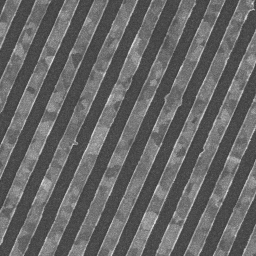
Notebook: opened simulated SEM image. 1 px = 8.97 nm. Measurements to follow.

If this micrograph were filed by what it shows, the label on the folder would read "parallel lines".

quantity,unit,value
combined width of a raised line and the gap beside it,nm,239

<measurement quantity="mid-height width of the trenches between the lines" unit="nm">124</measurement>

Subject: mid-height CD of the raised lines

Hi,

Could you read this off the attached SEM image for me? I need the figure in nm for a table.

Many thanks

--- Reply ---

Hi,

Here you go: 116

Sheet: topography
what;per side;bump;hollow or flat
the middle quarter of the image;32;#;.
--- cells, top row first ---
####....###....###....####....##
###....####...####....###....###
###....###....###....####....###
##....####....###....###....####
##....###....####...####....###.
#....####....###....###....####.
#....###....####....###....###..
#...####....###....####...####..
....###....####....###...#####..
....###....###....####...####...
...####...####....###....####...
...###....###....####...####....
..####....###....###....####...#
..###....####...####....###....#
.####...####....###....####...##
.###....####....###....###....##
####....###....####...####....##
###....####....###....###....###
###....###....####...####....###
###...####....###....####...####
##....###....####....###....###.
##....###....###....####...####.
#....####...####....###....####.
#....###....###....####...####..
....####....###....###....###...
....###....####...####....###...
...####....###....###....####...
...###....####....###....###....
..####....###....####...####...#
..###....####...####....###....#
..###....###....####....###....#
.####...####....###....###....##